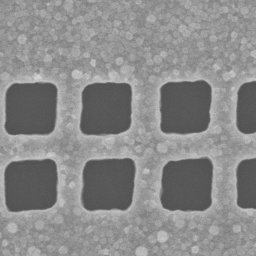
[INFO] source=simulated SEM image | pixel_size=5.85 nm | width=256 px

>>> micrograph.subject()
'holes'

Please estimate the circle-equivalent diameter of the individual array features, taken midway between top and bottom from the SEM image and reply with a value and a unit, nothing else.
333 nm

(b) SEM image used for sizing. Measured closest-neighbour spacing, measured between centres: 0.444 micrometres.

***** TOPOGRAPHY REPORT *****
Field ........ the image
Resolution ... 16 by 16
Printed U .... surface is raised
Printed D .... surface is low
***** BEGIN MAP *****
UUUUUUUUUUUUUUUU
UUUUUUUUUUUUUUUU
UUUUUUUUUUUUUUUU
UUUUUUUUUUUUUUUU
UUUUUUUUUUUUUUUU
UDDUUDDDUUDDDUUD
DDDDUDDDUUDDDUUD
DDDUUDDDUUDDDUUD
UUUUUUUUUUUUUUUU
UUUUUUUUUUUUUUUU
DDDDUDDDUUDDDUUD
DDDDUDDDUUDDDUUD
DDDDUDDDUUDDDUUD
UUUUUUUUUUUUUUUU
UUUUUUUUUUUUUUUU
UUUUUUUUUUUUUUUU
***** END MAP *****